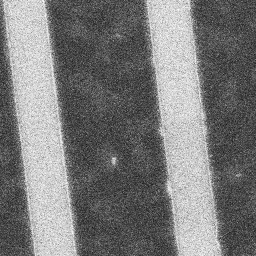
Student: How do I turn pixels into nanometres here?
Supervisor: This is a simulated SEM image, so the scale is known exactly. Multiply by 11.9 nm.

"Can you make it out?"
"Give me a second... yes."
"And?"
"one or a few lines or trenches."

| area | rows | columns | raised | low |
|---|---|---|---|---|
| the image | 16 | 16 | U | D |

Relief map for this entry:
DDDUUUUUUDDDUUUU
DDDUUUUUUDDDUUUU
UDDUUUUUUUDDUUUU
UDDUUUUUUUDDUUUU
UDDUUUUUUUDDUUUU
UDDUUUUUUUDDUUUU
UDDDUUUUUUDDDUUU
UDDDUUUUUUDDDUUU
UDDDUUUUUUDDDUUU
UDDDUUUUUUDDDUUU
UUDDUUUUUUUDDUUU
UUDDUUUUUUUDDUUU
UUDDUUUUUUUDDUUU
UUDDUUUUUUUDDUUU
UUDDDUUUUUUDDDUU
UUDDDUUUUUUDDDUU